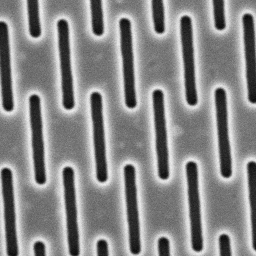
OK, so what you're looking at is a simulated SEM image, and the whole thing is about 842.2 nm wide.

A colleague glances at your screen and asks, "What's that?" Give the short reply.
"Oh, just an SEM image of a regular array of holes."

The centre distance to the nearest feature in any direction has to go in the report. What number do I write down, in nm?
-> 204